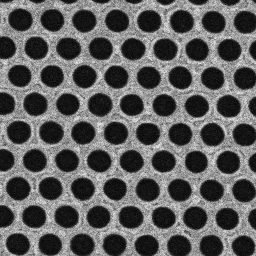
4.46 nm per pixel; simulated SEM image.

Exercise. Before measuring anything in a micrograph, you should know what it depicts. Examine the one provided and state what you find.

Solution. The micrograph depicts a regular array of holes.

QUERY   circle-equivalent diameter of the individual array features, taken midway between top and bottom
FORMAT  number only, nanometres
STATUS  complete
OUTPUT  98.2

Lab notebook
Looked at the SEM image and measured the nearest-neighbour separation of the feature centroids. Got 32 px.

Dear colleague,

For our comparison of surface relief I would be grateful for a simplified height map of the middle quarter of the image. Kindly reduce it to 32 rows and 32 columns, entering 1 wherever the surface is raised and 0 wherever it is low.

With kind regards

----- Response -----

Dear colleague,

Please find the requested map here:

11111011111101111111111111111111
11100001111000011110000111100001
11000000110000001100000011000000
11000000110000001100000011000000
11100000111000001110000011000000
11110011111100011111000111100001
11111111111111111111111111111111
00111111111111111111111111111111
00011110000111100001111000011110
00001100000011000000110000001100
00001100000011000000110000001100
00011100000011000000111000001100
00111111000111110001111000011110
11111111111111111111111111111111
11110111111111111111111111111111
11100001111000011110000111100001
11000000110000001100000011000000
11000000110000001100000011000000
11000001110000001110000011100000
11100011111000011110000111100001
11111111111111111111111111111111
01111111111111111111111111111111
00011110000111100001111000011110
00011100000011000000110000001110
00001100000011000000110000001100
00011100000111000000110000001110
00111110000111100001111000011110
11111111111111111111111111111111
11111111111111111111111111111111
11000001111000011110000111100001
11000001110000011100000011000000
11000000110000001100000011000000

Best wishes